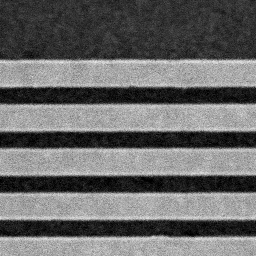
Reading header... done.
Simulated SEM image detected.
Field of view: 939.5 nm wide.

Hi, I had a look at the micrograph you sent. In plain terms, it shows parallel lines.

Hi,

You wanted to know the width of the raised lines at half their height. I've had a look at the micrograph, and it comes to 92.7 nanometres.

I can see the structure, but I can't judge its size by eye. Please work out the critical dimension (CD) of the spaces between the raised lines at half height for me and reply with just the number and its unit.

70.2 nm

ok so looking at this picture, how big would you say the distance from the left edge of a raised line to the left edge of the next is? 162 nm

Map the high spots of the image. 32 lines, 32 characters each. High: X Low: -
--------------------------------
--------------------------------
--------------------------------
--------------------------------
--------------------------------
--------------------------------
--------------------------------
--------------------------------
XXXXXXXXXXXXXXXXXXXXXXXXXXXXXXXX
XXXXXXXXXXXXXXXXXXXXXXXXXXXXXXXX
XXXXXXXXXXXXXXXXXXXXXXXXXXXXXXXX
--------------------------------
--------------------------------
XXXXXXXXXXXXXXXXXXXXXXXXXXXXXXXX
XXXXXXXXXXXXXXXXXXXXXXXXXXXXXXXX
XXXXXXXXXXXXXXXXXXXXXXXXXXXXXXXX
--------------------------------
--------------------------------
--------------------------------
XXXXXXXXXXXXXXXXXXXXXXXXXXXXXXXX
XXXXXXXXXXXXXXXXXXXXXXXXXXXXXXXX
XXXXXXXXXXXXXXXXXXXXXXXXXXXXXXXX
--------------------------------
--------------------------------
XXXXXXXXXXXXXXXXXXXXXXXXXXXXXXXX
XXXXXXXXXXXXXXXXXXXXXXXXXXXXXXXX
XXXXXXXXXXXXXXXXXXXXXXXXXXXXXXXX
--------------------------------
--------------------------------
--------------------------------
XXXXXXXXXXXXXXXXXXXXXXXXXXXXXXXX
XXXXXXXXXXXXXXXXXXXXXXXXXXXXXXXX